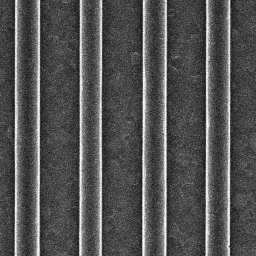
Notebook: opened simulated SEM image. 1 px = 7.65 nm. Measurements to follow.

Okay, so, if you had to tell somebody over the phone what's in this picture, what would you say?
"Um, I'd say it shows parallel lines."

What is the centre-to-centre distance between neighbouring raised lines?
487 nm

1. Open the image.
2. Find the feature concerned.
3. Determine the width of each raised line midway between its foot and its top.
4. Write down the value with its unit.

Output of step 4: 177 nanometers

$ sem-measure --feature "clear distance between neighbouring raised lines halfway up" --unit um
0.317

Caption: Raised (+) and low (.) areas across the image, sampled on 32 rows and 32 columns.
..+++.....+++.....+++.....+++...
..+++.....+++.....+++.....+++...
..+++.....+++.....+++.....+++...
..+++.....+++.....+++.....+++...
..+++.....+++.....+++.....+++...
..+++.....+++.....+++.....+++...
..+++.....+++.....+++.....+++...
..+++.....+++.....+++.....+++...
..+++.....+++.....+++.....+++...
..+++.....+++.....+++.....+++...
..+++.....+++.....+++.....+++...
..+++.....+++.....+++.....+++...
..+++.....+++.....+++.....+++...
..+++.....+++.....+++.....+++...
..+++.....+++.....+++.....+++...
..+++.....+++.....+++.....+++...
..+++.....+++.....+++.....+++...
..+++.....+++.....+++.....+++...
..+++.....+++.....+++.....+++...
..+++.....+++.....+++.....+++...
..+++.....+++.....+++.....+++...
..+++.....+++.....+++.....+++...
..+++.....+++.....+++.....+++...
..+++.....+++.....+++.....+++...
..+++.....+++.....+++.....+++...
..+++.....+++.....+++.....+++...
..+++.....+++.....+++.....+++...
..+++.....+++.....+++.....+++...
..+++.....+++.....+++.....+++...
..+++.....+++.....+++.....+++...
..+++.....+++.....+++.....+++...
..+++.....+++.....+++.....+++...